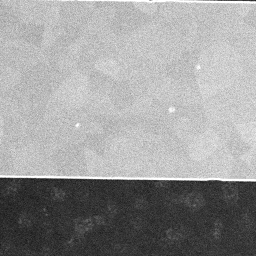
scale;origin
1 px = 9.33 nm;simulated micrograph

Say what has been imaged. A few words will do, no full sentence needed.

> one or a few lines or trenches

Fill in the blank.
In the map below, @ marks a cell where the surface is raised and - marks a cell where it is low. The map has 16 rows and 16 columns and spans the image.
@@@@@@@@@@@@@@@@
@@@@@@@@@@@@@@@@
@@@@@@@@@@@@@@@@
@@@@@@@@@@@@@@@@
@@@@@@@@@@@@@@@@
@@@@@@@@@@@@@@@@
@@@@@@@@@@@@@@@@
@@@@@@@@@@@@@@@@
@@@@@@@@@@@@@@@@
@@@@@@@@@@@@@@@@
@@@@@@@@@@@@@@@@
----------------
----------------
----------------
----------------
----------------